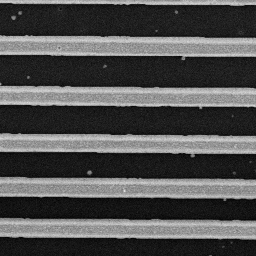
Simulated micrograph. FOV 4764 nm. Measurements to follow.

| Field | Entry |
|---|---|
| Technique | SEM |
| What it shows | lines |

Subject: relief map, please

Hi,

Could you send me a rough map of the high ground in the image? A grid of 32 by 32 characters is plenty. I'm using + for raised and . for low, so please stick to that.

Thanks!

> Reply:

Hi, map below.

..................++++++++++++++
................................
................................
................................
................................
++++++++++++++++++++++++++++++++
++++++++++++++++++++++++++++++++
................................
................................
................................
................................
++++++++++++++++++++++++++++++++
++++++++++++++++++++++++++++++++
................................
................................
................................
................................
++++++++++++++++++++++++++++++++
++++++++++++++++++++++++++++++++
................................
................................
................................
+++.............................
++++++++++++++++++++++++++++++++
++++++++++++++++++++++++++++++++
................................
................................
................................
++++++++++++++++++++++++++++++++
++++++++++++++++++++++++++++++++
................................
................................